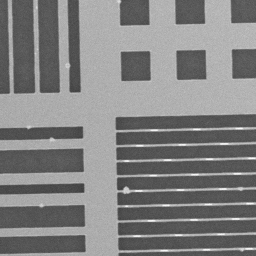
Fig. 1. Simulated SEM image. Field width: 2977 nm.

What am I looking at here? groups of lines, slits or small figures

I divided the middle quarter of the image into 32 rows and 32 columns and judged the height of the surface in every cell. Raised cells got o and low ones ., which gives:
o...oooooooooo........oooooo....
o...oooooooooo........oooooo....
o...oooooooooo........oooooo....
o...oooooooooo........oooooo....
o...oooooooooooooooooooooooooooo
o...oooooooooooooooooooooooooooo
o...oooooooooooooooooooooooooooo
oooooooooooooooooooooooooooooooo
oooooooooooooooooooooooooooooooo
oooooooooooooooooooooooooooooooo
oooooooooooooooooooooooooooooooo
oooooooooooooooooooooooooooooooo
oooooooooooooooooooooooooooooooo
ooooooooooooo...................
ooooooooooooo...................
ooooooooooooo...................
.....oooooooo...................
.....oooooooo...................
.....oooooooo...................
ooooooooooooo...................
ooooooooooooo...................
.....oooooooo...................
.....oooooooo...................
.....oooooooo...................
.....ooooooooo..................
.....oooooooo...................
.....oooooooo...................
ooooooooooooo...................
ooooooooooooo...................
ooooooooooooo...................
.....oooooooo...................
.....oooooooooooo...............